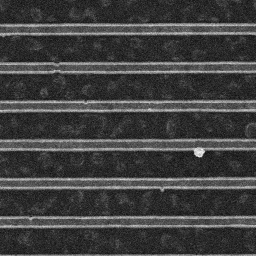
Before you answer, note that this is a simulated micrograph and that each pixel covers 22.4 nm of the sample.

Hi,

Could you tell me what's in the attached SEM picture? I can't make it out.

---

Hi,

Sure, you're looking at parallel lines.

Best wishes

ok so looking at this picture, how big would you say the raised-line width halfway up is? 0.215 microns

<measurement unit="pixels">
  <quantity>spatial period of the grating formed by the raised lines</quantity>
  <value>38.5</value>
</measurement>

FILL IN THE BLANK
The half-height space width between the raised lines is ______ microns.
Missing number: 0.643